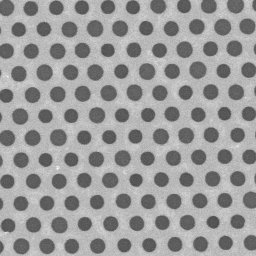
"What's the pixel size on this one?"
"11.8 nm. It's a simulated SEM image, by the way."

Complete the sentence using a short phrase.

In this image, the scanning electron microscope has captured a regular array of holes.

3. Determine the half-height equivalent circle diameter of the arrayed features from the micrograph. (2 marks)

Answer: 179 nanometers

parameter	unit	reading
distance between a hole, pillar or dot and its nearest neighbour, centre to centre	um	0.291